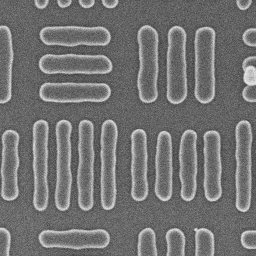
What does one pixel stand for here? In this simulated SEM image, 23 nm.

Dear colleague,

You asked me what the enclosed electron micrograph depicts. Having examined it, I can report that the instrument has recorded groups of lines, slits or small figures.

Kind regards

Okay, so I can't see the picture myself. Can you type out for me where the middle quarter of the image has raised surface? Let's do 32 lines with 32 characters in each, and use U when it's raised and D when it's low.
UUUUUUUUUUUUDDDDDDDUUUUDDDUUUUDD
UUUUUUUUUUUUDDDDDDDUUUUDDDUUUUDD
DDDDDDDDDDDDDDDDDDDUUUUDDDUUUUDD
DDDDDDDDDDDDDDDDDDDUUUUDDDUUUUDD
DDDDDDDDDDDDDDDDDDUUUUUDDDUUUUDD
UUUUUUUUUUUDDDDDDDDUUUUDDDUUUUDD
UUUUUUUUUUUDDDDDDDDUUUUDDDUUUUDD
UUUUUUUUUUUDDDDDDDDUUUUDDDUUUUDD
UUUUUUUUUUUDDDDDDDDUUUUDDDUUUUDD
DDDDDDDDDDDDDDDDDDDDUUDDDDDUUDDD
DDDDDDDDDDDDDDDDDDDDDDDDDDDDDDDD
DDDDDDDDDDDDDDDDDDDDDDDDDDDDDDDD
DDDDDDDDDDDDDDDDDDDDDDDDDDDDDDDD
DDDDDDDDDDDDDDDDDDDDDDDDDDDDDDDD
UDDDUUUDDDUUDDDDDDDDDDDDDDDDDDDD
UUDDUUUDDDUUUDDDDDDDDDDDDDDDDDDD
UUDDUUUDDDUUUDDDDDDDDDDDDDDDDDDD
UUDDUUUDDUUUUDDDDUUUDDDDUUDDDDUU
UDDDUUUDDUUUUDDDDUUUDDDDUUUDDUUU
UDDDUUUDDUUUUDDDDUUUDDDDUUUDDUUU
UUDDUUUDDUUUUDDDDUUUUDDUUUUDDUUU
UUDDUUUDDUUUUDDDDUUUUDDUUUUDDUUU
UUDDUUUDDUUUUDDDDUUUUDDUUUUDDUUU
UUDDUUUDDUUUUDDDDUUUUDDUUUUDDUUU
UDDDUUUDDDUUUDDDDUUUUDDUUUUDDUUU
UDDDUUUDDDUUUDDDDUUUUDDUUUUDDUUU
UUDDUUUDDDUUUDDDDUUUUDDUUUUDDUUU
UUDDUUUDDUUUUDDDDUUUUDDUUUUDDUUU
UUDUUUUDDUUUUDDDDUUUUDDUUUUDDUUU
UUDUUUUDDUUUUDDDDUUUUDDUUUUDDUUU
UUDUUUUDDUUUUDDDDUUUUDDUUUUDDDUU
UUDDUUUDDUUUUDDDDUUUUDDUUUUDDUUU